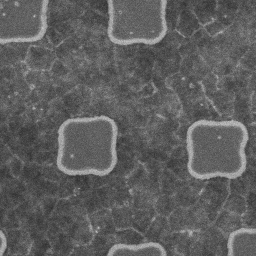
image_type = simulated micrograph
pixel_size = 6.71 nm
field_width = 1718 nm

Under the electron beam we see raised bodies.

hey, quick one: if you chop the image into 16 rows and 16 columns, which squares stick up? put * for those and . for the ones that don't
***....***......
***....***......
**.....***......
................
................
................
................
.....**.........
....***.....***.
....***.....***.
....***.....***.
................
................
................
...............*
.......***....**